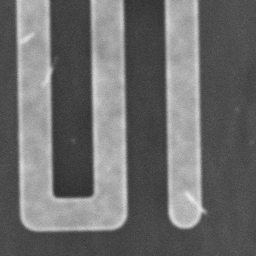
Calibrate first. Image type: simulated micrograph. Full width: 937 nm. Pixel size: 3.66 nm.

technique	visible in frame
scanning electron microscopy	groups of lines, slits or small figures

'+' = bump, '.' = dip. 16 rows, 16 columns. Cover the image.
.++...++..++....
.++...++..++....
.++...++..++....
.++...++..++....
.++...++..++....
.++...++..++....
.++...++..++....
.++...++..++....
.++...++..++....
.++...++..++....
.++...++...+....
.++...++...++...
.+++++++...++...
.+++++++...+....
................
................